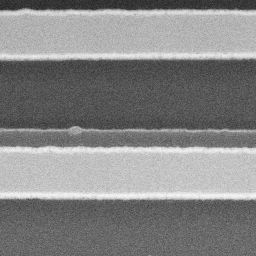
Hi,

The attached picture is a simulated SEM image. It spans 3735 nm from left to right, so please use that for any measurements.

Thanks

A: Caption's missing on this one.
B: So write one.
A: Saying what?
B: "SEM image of lines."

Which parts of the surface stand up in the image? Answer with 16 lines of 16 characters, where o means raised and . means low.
................
oooooooooooooooo
oooooooooooooooo
oooooooooooooooo
................
................
................
................
................
oooooooooooooooo
oooooooooooooooo
oooooooooooooooo
................
................
................
................